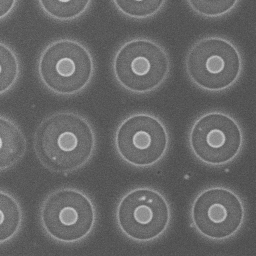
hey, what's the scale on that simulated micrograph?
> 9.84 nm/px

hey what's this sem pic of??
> an array of small figures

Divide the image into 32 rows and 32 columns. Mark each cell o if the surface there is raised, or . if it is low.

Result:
..ooo......oooo.....oooo.....ooo
.ooooo....oooooo...oooooo...oooo
oooooooooooooooooooooooooooooooo
oooooooooooooooooooooooooooooooo
oooooooooooooooooooooooooooooooo
ooooooo..ooooooo...oooooo....ooo
.ooooo.....oooo.....oooo......oo
..ooo...o..oooo..o...ooo..oo..oo
..ooo..oo..ooo...oo..ooo..oo..oo
..ooo......oooo......ooo......oo
.ooooo.....oooo.....ooooo....ooo
ooooooo..ooooooooooooooooooooooo
oooooooooooooooooooooooooooooooo
oooooooooooooooooooooooooooooooo
ooooooo..oooooooo.oooooooo..oooo
.ooooo.....oooo.....ooooo....ooo
..ooo......oooo......ooo..o...oo
...oo..oo...ooo..oo..ooo..oo..oo
...oo...o..oooo......ooo......oo
..ooo......oooo.....ooooo....ooo
.ooooo....ooooooo..ooooooooooooo
oooooooooooooooooooooooooooooooo
oooooooooooooooooooooooooooooooo
oooooooooooooooooooooooooooooooo
.oooooo...oooooo....ooooo....ooo
..oooo.....oooo......ooo......oo
..ooo...o...ooo..oo..ooo..oo..oo
..ooo...o...ooo..oo..ooo...o..oo
..oooo.....oooo......oooo.....oo
.oooooo...oooooo...ooooooo..oooo
oooooooooooooooooooooooooooooooo
oooooooooooooooooooooooooooooooo